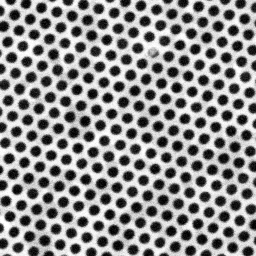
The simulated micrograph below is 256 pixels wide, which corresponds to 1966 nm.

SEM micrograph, a regular array of holes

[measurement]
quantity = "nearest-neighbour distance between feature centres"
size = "121 nm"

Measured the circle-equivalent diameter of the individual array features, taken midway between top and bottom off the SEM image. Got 93.4 nm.